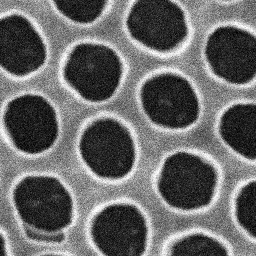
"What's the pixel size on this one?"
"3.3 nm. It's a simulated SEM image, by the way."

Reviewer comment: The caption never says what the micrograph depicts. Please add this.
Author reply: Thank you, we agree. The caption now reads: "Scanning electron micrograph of holes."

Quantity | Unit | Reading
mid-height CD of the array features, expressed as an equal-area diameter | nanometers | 196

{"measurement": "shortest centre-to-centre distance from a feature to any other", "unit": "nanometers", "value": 262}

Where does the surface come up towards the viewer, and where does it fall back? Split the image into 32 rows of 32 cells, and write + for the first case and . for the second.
+++++++......++++.....++++++++++
++++++++.....+++.......+++++++++
....+++++...++++.......+++++++++
....++++++++++++........+++...++
.....+++++++++++.......+++......
......++++...+++++.....+++......
......+++.....++++++..++++......
......++.......+++++++++++......
.....+++........++++++++++......
++.+++++.......++++....++++.....
++++++++.......+++......+++++..+
++++++++++....++++......++++++++
+.....+++++..+++++.......+++++++
+......+++++++++++.......++++...
.......+++++++++++.......+++....
.......++++....++++.....+++.....
+......+++......+++++++++++.....
+......+++.......+++++++++++....
++....++++.......++++++++++++...
++++++++++.......++++....+++++..
+++++++++++......+++.......+++++
++++++++++++....++++.......+++++
+++....++++++..+++++.......+++++
++......++++++++++++.......+++..
++.......+++++++++++.......+++..
++.......+++++..+++++.....+++...
++.......+++......+++++++++++...
+++......++.......++++++++++++..
++++....+++........+++++++++++..
+++++++++++.......+++++...+++++.
.+++++++++++......+++.......++++
.++++++++++++.....+++........+++